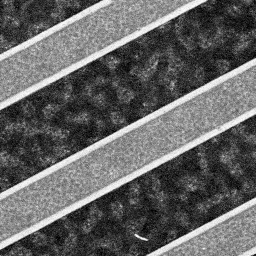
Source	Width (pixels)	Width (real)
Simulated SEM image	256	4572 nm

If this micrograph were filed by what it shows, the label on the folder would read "one or a few lines or trenches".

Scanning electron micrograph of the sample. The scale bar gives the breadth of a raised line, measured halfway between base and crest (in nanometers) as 801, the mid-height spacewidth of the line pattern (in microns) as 1.4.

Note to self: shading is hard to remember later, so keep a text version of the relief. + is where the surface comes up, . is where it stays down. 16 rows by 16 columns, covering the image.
......++++++....
....++++++......
..++++++........
++++++..........
++++...........+
++...........+++
...........+++++
.........++++++.
.......++++++...
.....++++++.....
...++++++.......
.++++++.........
++++++..........
++++..........++
++..........++++
..........++++++